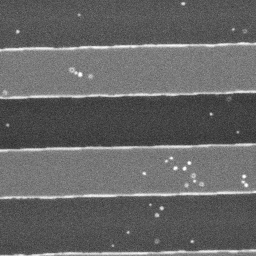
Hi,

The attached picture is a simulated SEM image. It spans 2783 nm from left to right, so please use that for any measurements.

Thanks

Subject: lines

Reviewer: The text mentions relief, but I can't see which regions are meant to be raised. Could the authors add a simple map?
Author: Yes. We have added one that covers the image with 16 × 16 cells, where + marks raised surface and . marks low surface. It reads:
................
................
................
++++++++++++++++
++++++++++++++++
++++++++++++++++
................
................
................
++++++++++++++++
++++++++++++++++
++++++++++++++++
................
................
................
................